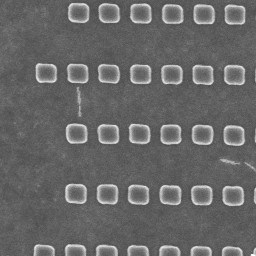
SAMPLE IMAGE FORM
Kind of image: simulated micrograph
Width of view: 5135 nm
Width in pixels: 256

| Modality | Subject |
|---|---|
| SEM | a regular array of raised bodies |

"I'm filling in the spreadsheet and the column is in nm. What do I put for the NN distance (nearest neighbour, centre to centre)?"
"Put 629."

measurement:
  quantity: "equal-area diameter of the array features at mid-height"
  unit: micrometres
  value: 0.412